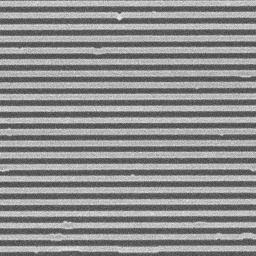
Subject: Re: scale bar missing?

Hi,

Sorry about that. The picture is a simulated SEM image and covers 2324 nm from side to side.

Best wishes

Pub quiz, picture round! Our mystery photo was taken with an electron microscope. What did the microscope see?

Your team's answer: parallel lines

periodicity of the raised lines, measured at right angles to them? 106 nm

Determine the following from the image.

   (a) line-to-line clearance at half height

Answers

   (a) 5.87 px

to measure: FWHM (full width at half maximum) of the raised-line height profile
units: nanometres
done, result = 52.2